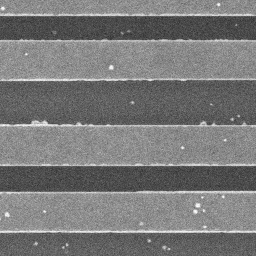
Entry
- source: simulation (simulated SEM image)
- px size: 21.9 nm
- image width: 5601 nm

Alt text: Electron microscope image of lines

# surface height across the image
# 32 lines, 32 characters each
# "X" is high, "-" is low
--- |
XXXXXXXXXXXXXXXXXXXXXXXXXXXXXXXX
XXXXXXXXXXXXXXXXXXXXXXXXXXXXXXXX
--------------------------------
--------------------------------
--------------------------------
XXXXXXXXXXXXXXXXXXXXXXXXXXXXXXXX
XXXXXXXXXXXXXXXXXXXXXXXXXXXXXXXX
XXXXXXXXXXXXXXXXXXXXXXXXXXXXXXXX
XXXXXXXXXXXXXXXXXXXXXXXXXXXXXXXX
XXXXXXXXXXXXXXXXXXXXXXXXXXXXXXXX
--------------------------------
--------------------------------
--------------------------------
--------------------------------
--------------------------------
--------------------------------
XXXXXXXXXXXXXXXXXXXXXXXXXXXXXXXX
XXXXXXXXXXXXXXXXXXXXXXXXXXXXXXXX
XXXXXXXXXXXXXXXXXXXXXXXXXXXXXXXX
XXXXXXXXXXXXXXXXXXXXXXXXXXXXXXXX
XXXXXXXXXXXXXXXXXXXXXXXXXXXXXXXX
--------------------------------
--------------------------------
--------------------------------
XXXXXXXXXXXXXXXXXXXXXXXXXXXXXXXX
XXXXXXXXXXXXXXXXXXXXXXXXXXXXXXXX
XXXXXXXXXXXXXXXXXXXXXXXXXXXXXXXX
XXXXXXXXXXXXXXXXXXXXXXXXXXXXXXXX
XXXXXXXXXXXXXXXXXXXXXXXXXXXXXXXX
--------------------------------
--------------------------------
--------------------------------